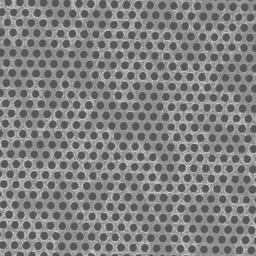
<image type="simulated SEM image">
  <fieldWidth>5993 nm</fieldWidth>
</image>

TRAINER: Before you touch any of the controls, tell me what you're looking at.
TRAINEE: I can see a regular array of holes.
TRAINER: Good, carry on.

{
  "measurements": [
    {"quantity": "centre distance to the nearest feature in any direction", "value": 11.4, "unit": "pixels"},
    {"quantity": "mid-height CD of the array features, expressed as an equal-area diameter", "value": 194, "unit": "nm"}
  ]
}